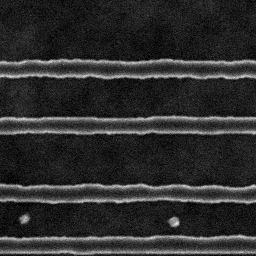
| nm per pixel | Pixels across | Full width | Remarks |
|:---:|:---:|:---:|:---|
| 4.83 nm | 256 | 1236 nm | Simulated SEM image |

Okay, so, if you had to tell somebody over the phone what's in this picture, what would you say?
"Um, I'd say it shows lines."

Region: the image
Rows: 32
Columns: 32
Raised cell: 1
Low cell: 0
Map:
00000000000000000000000000000000
00000000000000000000000000000000
00000000000000000000000000000000
00000000000000000000000000000000
00000000000000000000000000000000
00000000000000000000000000000000
00000000000000000000000000000000
00000001110000000000110000000000
11111111111111111111111111111111
11111111111111111111111111111111
00000000000000000000000000000000
00000000000000000000000000000000
00000000000000000000000000000000
00000000000000000000000000000000
00000000000000000000000000000000
11111111111111111111111111111111
11111111111111111111111111111111
00000000000000000000000000000000
00000000000000000000000000000000
00000000000000000000000000000000
00000000000000000000000000000000
00000000000000000000000000000000
00000000000000000000000000000000
11111111111111111111111111111011
11111111111111111111111111111111
00000000000000000000000000000000
00000000000000000000000000000000
00000000000000000000000000000000
00000000000000000000000000000000
00000000000000000000000000000100
11111111111111111111111111111111
11111111111111111111111111111111